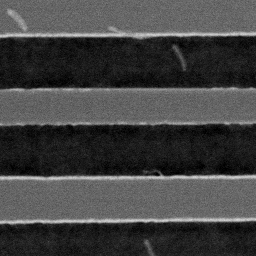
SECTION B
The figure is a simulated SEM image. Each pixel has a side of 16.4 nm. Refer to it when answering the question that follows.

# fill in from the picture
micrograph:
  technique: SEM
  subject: lines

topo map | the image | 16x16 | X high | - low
XXXXXXXXXXXXXXXX
XXXXXXXXXXXXXXXX
----------------
----------------
----------------
----------------
XXXXXXXXXXXXXXXX
XXXXXXXXXXXXXXXX
----------------
----------------
----------------
XXXXXXXXXXXXXXXX
XXXXXXXXXXXXXXXX
XXXXXXXXXXXXXXXX
----------------
----------------